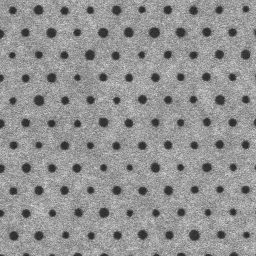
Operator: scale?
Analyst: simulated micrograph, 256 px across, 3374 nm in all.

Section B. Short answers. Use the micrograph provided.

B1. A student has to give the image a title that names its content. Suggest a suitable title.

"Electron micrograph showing a regular array of holes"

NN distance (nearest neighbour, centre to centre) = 25.4 px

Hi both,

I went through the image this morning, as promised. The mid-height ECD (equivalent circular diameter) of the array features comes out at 114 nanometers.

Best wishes